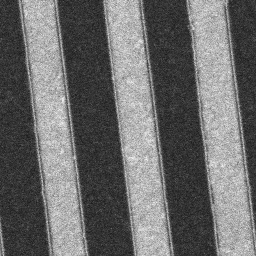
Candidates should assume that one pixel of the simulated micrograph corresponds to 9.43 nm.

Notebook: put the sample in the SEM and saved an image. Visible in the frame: one or a few lines or trenches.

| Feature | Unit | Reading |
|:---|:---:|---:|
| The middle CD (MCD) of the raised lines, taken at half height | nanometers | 452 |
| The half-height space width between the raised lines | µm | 0.338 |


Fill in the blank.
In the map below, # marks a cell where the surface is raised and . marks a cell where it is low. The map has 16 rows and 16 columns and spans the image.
#...###..###..##
#...###..###..##
##..###..###..##
##..###..###...#
##..###..###...#
##..###..###...#
##..###...##...#
##..###...###..#
##...###..###..#
##...###..###..#
###..###..###..#
###..###..###...
###..###..###...
###..###..###...
###..###...##...
###..###...###..